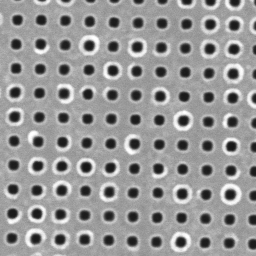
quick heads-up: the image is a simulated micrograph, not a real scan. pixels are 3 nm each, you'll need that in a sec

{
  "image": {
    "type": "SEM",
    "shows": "a regular array of holes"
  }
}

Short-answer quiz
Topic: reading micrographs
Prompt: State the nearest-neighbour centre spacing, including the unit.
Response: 0.0711 um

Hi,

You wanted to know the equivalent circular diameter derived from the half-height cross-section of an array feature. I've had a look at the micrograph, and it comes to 33.5 nm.